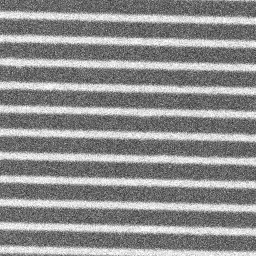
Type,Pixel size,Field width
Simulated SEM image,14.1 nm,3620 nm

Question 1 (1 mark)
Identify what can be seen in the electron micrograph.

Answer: parallel lines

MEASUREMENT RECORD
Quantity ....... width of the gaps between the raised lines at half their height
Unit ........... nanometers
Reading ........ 254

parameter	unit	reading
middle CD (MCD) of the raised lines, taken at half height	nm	76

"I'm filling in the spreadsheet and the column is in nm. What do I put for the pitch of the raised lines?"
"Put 331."